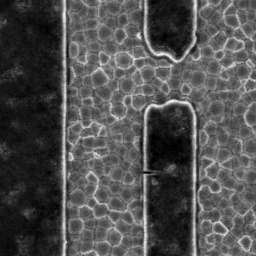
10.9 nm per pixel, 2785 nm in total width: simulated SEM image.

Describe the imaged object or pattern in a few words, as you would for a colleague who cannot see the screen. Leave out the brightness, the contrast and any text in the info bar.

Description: one or a few lines or trenches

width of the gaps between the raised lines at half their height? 0.878 microns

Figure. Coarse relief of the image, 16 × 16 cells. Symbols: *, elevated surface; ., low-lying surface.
****.....***....
****.....***....
****.....***....
****......*.....
****............
****............
****......**....
****.....***....
****.....***....
****.....***....
****.....***....
****.....***....
****.....***....
****.....***....
****.....***....
****.....***....